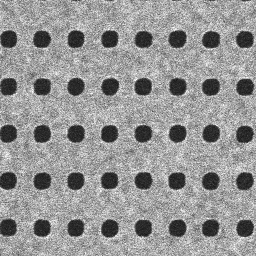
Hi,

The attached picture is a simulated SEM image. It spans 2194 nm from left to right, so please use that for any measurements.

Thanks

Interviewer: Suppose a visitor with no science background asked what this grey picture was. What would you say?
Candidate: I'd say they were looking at a regular array of holes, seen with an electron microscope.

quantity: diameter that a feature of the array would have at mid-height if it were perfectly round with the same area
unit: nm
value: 157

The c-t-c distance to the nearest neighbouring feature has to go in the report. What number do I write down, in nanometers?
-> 288